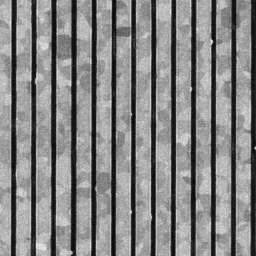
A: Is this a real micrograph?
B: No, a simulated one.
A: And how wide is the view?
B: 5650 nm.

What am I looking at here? parallel lines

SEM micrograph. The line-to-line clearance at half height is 127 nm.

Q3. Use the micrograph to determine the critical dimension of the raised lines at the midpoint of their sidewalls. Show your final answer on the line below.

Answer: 320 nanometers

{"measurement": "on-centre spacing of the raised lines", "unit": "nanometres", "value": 440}